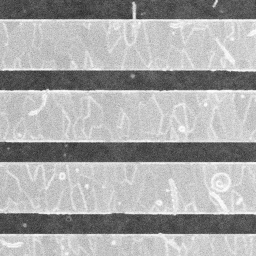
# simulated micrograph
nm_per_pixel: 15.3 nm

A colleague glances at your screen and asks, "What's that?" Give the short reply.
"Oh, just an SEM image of lines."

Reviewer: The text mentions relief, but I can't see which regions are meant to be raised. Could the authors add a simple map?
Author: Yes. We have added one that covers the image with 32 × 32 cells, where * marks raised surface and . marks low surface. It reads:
................................
................................
................*...............
********************************
********************************
********************************
********************************
********************************
********************************
................................
................................
********************************
********************************
********************************
********************************
********************************
********************************
********************************
................................
................................
********************************
********************************
********************************
********************************
********************************
********************************
********************************
................................
................................
********************************
********************************
********************************